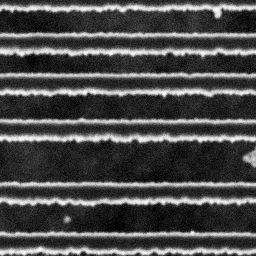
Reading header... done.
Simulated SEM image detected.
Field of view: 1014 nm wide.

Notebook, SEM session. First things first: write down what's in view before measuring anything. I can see lines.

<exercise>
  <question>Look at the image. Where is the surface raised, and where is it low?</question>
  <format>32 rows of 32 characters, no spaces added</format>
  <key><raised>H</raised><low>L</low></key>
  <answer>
HHHHHHHHHHHHHHHHHHHHHHHHHHHHHHHH
LLLLLLLLLLLLLLLLLLLLLLLLLLLLLLLL
LLLLLLLLLLLLLLLLLLLLLLLLLLLLLLLL
LLLLLLLLLLLLLLLLLLLLLLLLLLLLLLLL
HHHHHHHHHHHHHHHHHHHHHHHHHHHHHHHH
HHHHHHHHHHHHHHHHHHHHHHHHHHHHHHHH
HHHHHLHHHHHHHHHHHHHHHHHHHHHLHHHH
LLLLLLLLLLLLLLLLLLLLLLLLLLLLLLLL
LLLLLLLLLLLLLLLLLLLLLLLLLLLLLLLL
HHHHHHHHHHHHHHHHHHHHHHHHHHHHHHHH
HHHHHHHHHHHHHHHHHHHHHHHHHHHHHHHH
HHHHHHHHHHHHHHHHHHHHHHHHHHHHHHHH
LLLLLLLLLLLLLLLLLLLLLLLLLLLLLLLL
LLLLLLLLLLLLLLLLLLLLLLLLLLLLLLLL
LLLLLLLLLLLLLLLLLLLLLLLLLLLLLLLL
HHHHHHHHHHHHHHHHHHHHHHHHHHHHHHHH
HHHHHHHHHHHHHHHHHHHHHHHHHHHHHHHH
LHLLLLLHLLLLLLHHLLHLLHLLLHLHLLLH
LLLLLLLLLLLLLLLLLLLLLLLLLLLLLLLL
LLLLLLLLLLLLLLLLLLLLLLLLLLLLLLLH
LLLLLLLLLLLLLLLLLLLLLLLLLLLLLLLL
LLLLLLLLLLLLLLLLLLLLLLLLLLLLLLLL
LLLLLLLLLLLLLLLLLLLLLLLLLLLLLLLL
HHHHHHHHHHHHHHHHHHHHHHHHHHHHHHHH
HHHHHHHHHHHHHHHHHHHHHHHHHHHHHHHH
LLLLLLLLLLHHLLLLLLLLLLLLLLLLLLLL
LLLLLLLLLLLLLLLLLLLLLLLLLLLLLLLL
LLLLLLLLLLLLLLLLLLLLLLLLLLLLLLLL
LLLLLLLLLLLLLLLLLLLLLLLLLLLLLLLL
HHHHHHHHHHHHHHHHHHHHHHHHHHHHHHHH
HHHHHHHHHHHHHHHHHHHHHHHHHHHHHHHH
HHHHHHHHHHLHHHHHHHHHHHHHHHHHHHHH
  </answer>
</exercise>